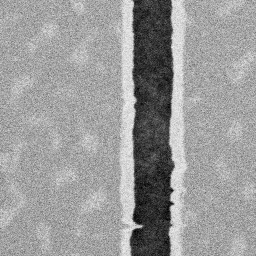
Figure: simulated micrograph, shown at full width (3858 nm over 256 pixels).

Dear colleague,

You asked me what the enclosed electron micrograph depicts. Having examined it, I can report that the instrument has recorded one or a few lines or trenches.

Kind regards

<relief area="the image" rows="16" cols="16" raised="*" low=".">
********...*****
********...*****
********...*****
********...*****
********...*****
********...*****
********...*****
********...*****
********...*****
********...*****
********...*****
********...*****
********...*****
********...*****
********...*****
********...*****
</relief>